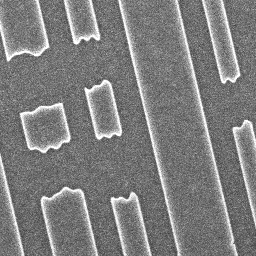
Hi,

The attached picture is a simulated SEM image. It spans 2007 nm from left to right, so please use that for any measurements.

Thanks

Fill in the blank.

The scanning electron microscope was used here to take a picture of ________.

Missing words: one or a few lines or trenches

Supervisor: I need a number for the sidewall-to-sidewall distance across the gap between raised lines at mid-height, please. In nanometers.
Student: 212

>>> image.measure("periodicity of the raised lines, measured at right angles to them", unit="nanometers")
505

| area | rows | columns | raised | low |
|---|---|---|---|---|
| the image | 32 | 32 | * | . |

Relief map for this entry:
*****...***....*******....**....
*****...****...*******....**....
*****....***...********...**....
*****....***....*******...***...
******...***....*******...***...
.*****..........*******....**...
.****...........********...**...
.................*******...**...
.................*******...***..
.................*******....**..
.............*...********.......
...........***....*******.......
...........***....*******.......
.....***...***....*******.......
...*****....***...*******.......
...*****....***....*******....*.
...*****....***....*******...***
...*****...........*******....**
....**.............*******....**
...................********...**
....................*******...**
....................*******...**
*...................*******....*
*...................********...*
*......***......*....*******...*
*....******...***....*******...*
**...******...****...*******....
**....*****....***...********...
**....*****....***....*******...
**....******...***....*******...
***...******...***....*******...
***....*****....***...*******...